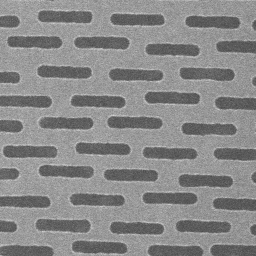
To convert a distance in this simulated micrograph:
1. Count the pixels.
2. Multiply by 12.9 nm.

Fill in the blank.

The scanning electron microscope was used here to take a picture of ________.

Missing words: a regular array of holes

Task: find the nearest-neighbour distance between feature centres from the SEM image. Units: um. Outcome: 0.538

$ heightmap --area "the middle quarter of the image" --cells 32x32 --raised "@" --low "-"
--@@@@@@@@@@@@@@@@@@@@@@@@@@@@@@
-------@@@@@------------@@@@@---
-------@@@@--------------@@@@---
------@@@@@--------------@@@@---
@@@@@@@@@@@@@@@@@@@@@@-@@@@@@@@@
@@@@@@@@@@@@@@@@@@@@@@@@@@@@@@@@
@@@@@@@@@@@@@@@@@@@@@@@@@@@@@@@@
@@@@@@@@@@@@@@@@@@@@------------
@@-------------@@@@@------------
@@--------------@@@@------------
@@-------------@@@@@@@@@@@@@@@@@
@@@@@@@@@@@@@@@@@@@@@@@@@@@@@@@@
@@@@@@@@@@@@@@@@@@@@@@@@@@@@@@@@
-------@@@@-------------@@@@@@@@
--------@@---------------@@@@@@-
-------@@@@--------------@@@@---
@@@@--@@@@@@@@@@@@@@@--@@@@@@---
@@@@@@@@@@@@@@@@@@@@@@@@@@@@@@--
@@@@@@@@@@@@@@@@@@@@@@@@@@@@@@@@
@@@@----@@@@@@@@@@@@@@@@@@@@@@@@
@@@-------------@@@@@@@@@@@@@@@@
@@@--------------@@@------------
@@@-------------@@@@------------
@@@@@@@@@@@@@@@@@@@@------------
@@@@@@@@@@@@@@@@@@@@@@@@@@@@@@@@
-------@@@@@@@@@@@@@@@@@@@@@@@@@
--------@@-------------@@@@@@@@@
--------@@--------------@@@@@@--
-------@@@--------------@@@@----
@@@@@@@@@@@@@---@@@@---@@@@@----
@@@@@@@@@@@@@@@@@@@@@@@@@@@@@---
@@@@@@@@@@@@@@@@@@@@@@@@@@@@@@@@